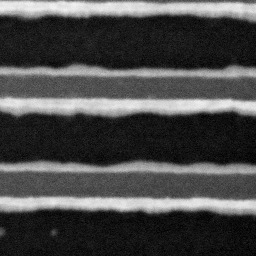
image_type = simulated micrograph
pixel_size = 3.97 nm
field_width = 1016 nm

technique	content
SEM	lines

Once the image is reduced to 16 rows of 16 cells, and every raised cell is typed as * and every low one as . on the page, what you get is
****************
................
................
................
***.**..........
****************
****************
................
................
................
.**.....*.......
****************
****************
................
................
................